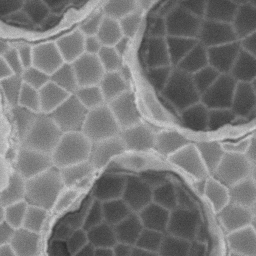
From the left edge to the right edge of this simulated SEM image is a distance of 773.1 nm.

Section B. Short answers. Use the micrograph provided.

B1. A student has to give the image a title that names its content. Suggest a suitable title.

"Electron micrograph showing holes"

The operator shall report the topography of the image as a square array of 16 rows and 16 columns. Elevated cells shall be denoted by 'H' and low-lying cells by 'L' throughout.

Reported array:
LLLLLHHHHLLLLLLL
LLLLHHHHHLLLLLLL
HHHHHHHHHLLLLLLL
HHHHHHHHHLLLLLLL
HHHHHHHHHLLLLLLL
HHHHHHHHHLLLLLLL
HHHHHHHHHHLLLLLL
HHHHHHHHHHHLLLLL
HHHHHHHHHHHHHHHH
HHHHHHHHHHHHHHHH
HHHHHHHLLLLHHHHH
HHHHHHLLLLLLHHHH
HHHHHLLLLLLLLHHH
HHHHLLLLLLLLLHHH
HHHLLLLLLLLLLLHH
HHHLLLLLLLLLLLHH